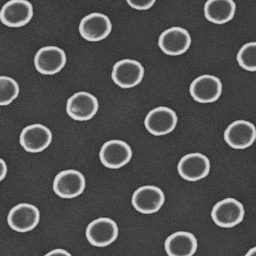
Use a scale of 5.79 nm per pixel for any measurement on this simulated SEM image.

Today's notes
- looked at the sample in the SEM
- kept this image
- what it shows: a regular array of raised bodies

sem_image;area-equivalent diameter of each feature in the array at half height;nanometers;158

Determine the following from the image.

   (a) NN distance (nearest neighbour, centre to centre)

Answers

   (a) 325 nm